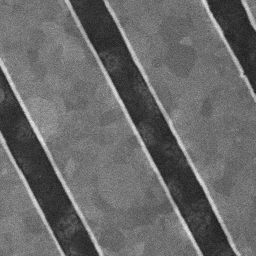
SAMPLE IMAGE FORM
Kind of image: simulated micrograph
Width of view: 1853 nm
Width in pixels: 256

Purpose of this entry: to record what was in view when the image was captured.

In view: one or a few lines or trenches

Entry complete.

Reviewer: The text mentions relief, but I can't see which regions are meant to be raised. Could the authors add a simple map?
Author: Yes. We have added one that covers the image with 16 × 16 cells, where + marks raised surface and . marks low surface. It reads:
++++...++++++..+
+++++..++++++...
+++++...++++++..
++++++..+++++++.
+++++++..++++++.
.++++++..+++++++
.+++++++..++++++
..++++++...+++++
..+++++++..+++++
+..++++++...++++
+..+++++++..++++
++..++++++...+++
++...++++++..+++
+++..++++++...++
+++...++++++..++
++++..++++++...+